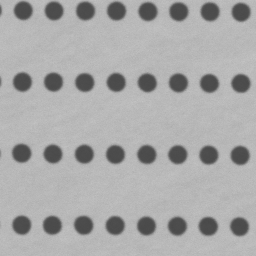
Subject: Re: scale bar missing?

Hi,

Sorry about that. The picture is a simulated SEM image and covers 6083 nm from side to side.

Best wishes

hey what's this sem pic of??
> a regular array of holes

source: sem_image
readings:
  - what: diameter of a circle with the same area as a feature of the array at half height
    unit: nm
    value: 442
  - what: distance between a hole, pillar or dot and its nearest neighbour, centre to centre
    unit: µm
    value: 0.737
